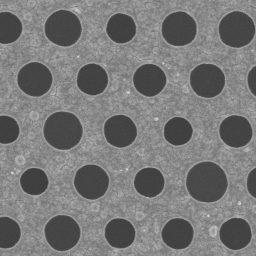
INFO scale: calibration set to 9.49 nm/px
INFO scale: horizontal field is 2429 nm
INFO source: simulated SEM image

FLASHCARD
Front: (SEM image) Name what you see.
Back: a regular array of holes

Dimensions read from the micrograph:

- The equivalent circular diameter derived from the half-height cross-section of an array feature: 308 nm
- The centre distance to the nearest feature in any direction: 545 nm